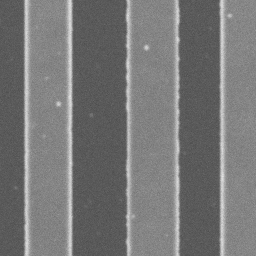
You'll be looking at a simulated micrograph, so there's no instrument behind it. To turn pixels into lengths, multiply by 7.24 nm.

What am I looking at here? lines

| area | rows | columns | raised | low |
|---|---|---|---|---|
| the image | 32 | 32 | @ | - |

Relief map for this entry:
---@@@@@@-------@@@@@@------@@@@
---@@@@@@-------@@@@@@------@@@@
---@@@@@@-------@@@@@@------@@@@
---@@@@@@-------@@@@@@------@@@@
---@@@@@@-------@@@@@@------@@@@
---@@@@@@-------@@@@@@------@@@@
---@@@@@@-------@@@@@@------@@@@
---@@@@@@-------@@@@@@------@@@@
---@@@@@@-------@@@@@@------@@@@
---@@@@@@-------@@@@@@------@@@@
---@@@@@@-------@@@@@@------@@@@
---@@@@@@-------@@@@@@------@@@@
---@@@@@@-------@@@@@@------@@@@
---@@@@@@-------@@@@@@------@@@@
---@@@@@@-------@@@@@@------@@@@
---@@@@@@-------@@@@@@------@@@@
---@@@@@@-------@@@@@@------@@@@
---@@@@@@-------@@@@@@------@@@@
---@@@@@@-------@@@@@@------@@@@
---@@@@@@-------@@@@@@------@@@@
---@@@@@@-------@@@@@@------@@@@
---@@@@@@-------@@@@@@------@@@@
---@@@@@@-------@@@@@@------@@@@
---@@@@@@-------@@@@@@------@@@@
---@@@@@@-------@@@@@@------@@@@
---@@@@@@-------@@@@@@------@@@@
---@@@@@@-------@@@@@@------@@@@
---@@@@@@-------@@@@@@------@@@@
---@@@@@@-------@@@@@@------@@@@
---@@@@@@-------@@@@@@------@@@@
---@@@@@@-------@@@@@@------@@@@
---@@@@@@-------@@@@@@------@@@@